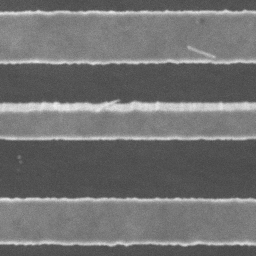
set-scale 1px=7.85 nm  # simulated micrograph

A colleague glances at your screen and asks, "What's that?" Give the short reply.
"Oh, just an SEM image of lines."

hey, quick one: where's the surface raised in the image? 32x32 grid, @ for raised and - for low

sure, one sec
--------------------------------
---@@@@@@-@@@@@@@@@@@@@@@@@@@@@@
@@@@@@@@@@@@@@@@@@@@@@@@@@@@@@@@
@@@@@@@@@@@@@@@@@@@@@@@@@@@@@@@@
@@@@@@@@@@@@@@@@@@@@@@@@@@@@@@@@
@@@@@@@@@@@@@@@@@@@@@@@@@@@@@@@@
@@@@@@@@@@@@@@@@@@@@@@@@@@@@@@@@
@@@@@@@@@@@@@@@@@@@@@@@@@@@@@@@@
--------------------------------
--------------------------------
--------------------------------
--------------------------------
--------------------------------
@@@@@@@@@@@@@@@@@@@@@@@@@@@@@@@@
@@@@@@@@@@@@@@@@@@@@@@@@@@@@@@@@
@@@@@@@@@@@@@@@@@@@@@@@@@@@@@@@@
@@@@@@@@@@@@@@@@@@@@@@@@@@@@@@@@
--------------------------------
--------------------------------
--------------------------------
--------------------------------
--------------------------------
--------------------------------
--------------------------------
--------------------------------
@@@@@@@@@@@@@@@@@@@@@@@@@@@@@@@@
@@@@@@@@@@@@@@@@@@@@@@@@@@@@@@@@
@@@@@@@@@@@@@@@@@@@@@@@@@@@@@@@@
@@@@@@@@@@@@@@@@@@@@@@@@@@@@@@@@
@@@@@@@@@@@@@@@@@@@@@@@@@@@@@@@@
--@@@--@@@@@@@@@@--@@@@@@@@@@@@@
--------------------------------